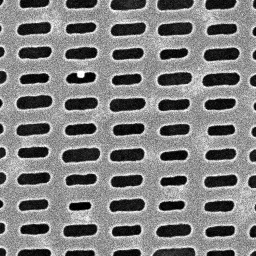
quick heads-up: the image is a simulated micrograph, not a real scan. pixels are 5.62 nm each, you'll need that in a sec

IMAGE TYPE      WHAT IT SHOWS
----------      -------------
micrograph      a regular array of holes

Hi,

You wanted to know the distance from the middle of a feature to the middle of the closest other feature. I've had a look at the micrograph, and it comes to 140 nanometres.